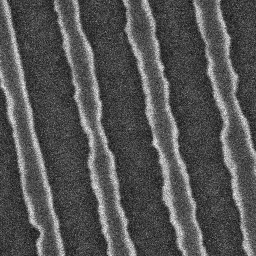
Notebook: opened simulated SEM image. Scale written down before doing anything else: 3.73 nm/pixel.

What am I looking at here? one or a few lines or trenches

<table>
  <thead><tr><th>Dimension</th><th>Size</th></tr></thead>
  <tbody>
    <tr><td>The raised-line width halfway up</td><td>73.8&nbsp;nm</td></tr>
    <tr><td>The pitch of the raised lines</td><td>68.7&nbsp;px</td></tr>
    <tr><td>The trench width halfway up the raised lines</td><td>181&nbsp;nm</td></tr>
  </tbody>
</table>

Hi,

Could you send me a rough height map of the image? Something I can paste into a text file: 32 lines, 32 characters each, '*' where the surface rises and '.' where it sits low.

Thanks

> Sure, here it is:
*......***......**......***.....
*......***......***......**.....
*......***......***......***....
*.......**......***......***....
**......***.....***......***....
**......***......***......**....
**......***......***......**....
**.......**......***......***...
***......***......**......***...
***......***......**.......**...
***......***......***......**...
.**.......**......***......**...
.**.......**.......**......**...
.***......**.......**.......**..
.***......**.......**.......**..
..**.......*.......***......***.
..**.......**......***......***.
..**.......**......***......***.
..***.......*.......**......***.
..***......***......**......****
...**......***......***......***
...**.......**.......**......***
...***......**.......**......***
...***......***......***.....***
...***......***......***......**
....**.......**......***......**
....***......**......***......**
....***......***......**......**
.....**......***......***.....**
.....**......***......***......*
.....***......**......***......*
.....***......***......**......*